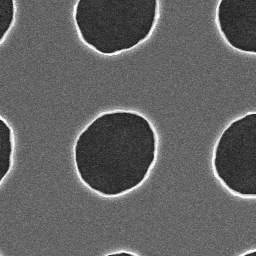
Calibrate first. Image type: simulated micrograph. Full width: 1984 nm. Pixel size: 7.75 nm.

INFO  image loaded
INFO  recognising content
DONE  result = holes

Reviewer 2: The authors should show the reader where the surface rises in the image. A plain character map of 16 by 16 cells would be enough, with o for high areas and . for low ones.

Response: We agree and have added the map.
.oooo.....oooo..
.oooo.....oooo..
ooooo....ooooo..
oooooooooooooooo
oooooooooooooooo
oooooooooooooooo
oooooooooooooooo
oooooo...oooooo.
.oooo.....oooo..
.oooo.....ooo...
.oooo....oooo...
ooooo....ooooo..
oooooooooooooooo
oooooooooooooooo
oooooooooooooooo
oooooooooooooooo